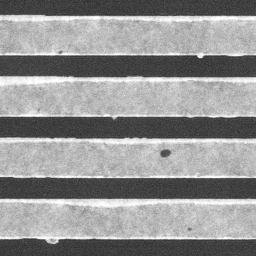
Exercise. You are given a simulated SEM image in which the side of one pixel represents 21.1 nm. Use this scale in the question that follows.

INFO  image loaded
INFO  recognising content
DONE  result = lines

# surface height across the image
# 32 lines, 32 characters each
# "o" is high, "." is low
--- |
................................
................................
oooooooooooooooooooooooooooooooo
oooooooooooooooooooooooooooooooo
oooooooooooooooooooooooooooooooo
oooooooooooooooooooooooooooooooo
oooooooooooooooooooooooooooooooo
................................
................................
................................
oooooooooooooooooooooooooooooooo
oooooooooooooooooooooooooooooooo
oooooooooooooooooooooooooooooooo
oooooooooooooooooooooooooooooooo
..........................o.o...
................................
................................
.oo.ooooo.......................
oooooooooooooooooooooooooooooooo
oooooooooooooooooooooooooooooooo
oooooooooooooooooooooooooooooooo
oooooooooooooooooooooooooooooooo
................................
................................
................................
oooooooooooooooooooooooooooooooo
oooooooooooooooooooooooooooooooo
oooooooooooooooooooooooooooooooo
oooooooooooooooooooooooooooooooo
oooooooooooooooooooooooooooooooo
................................
................................